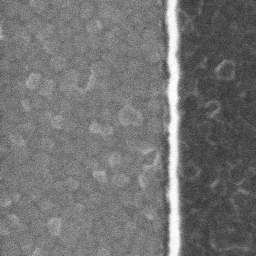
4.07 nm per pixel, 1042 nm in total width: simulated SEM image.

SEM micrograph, one or a few lines or trenches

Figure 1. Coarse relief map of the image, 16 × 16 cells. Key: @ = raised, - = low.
-----------@@@@@
-----------@@@@@
-----------@@@@@
-----------@@@@@
-----------@@@@@
-----------@@@@@
-----------@@@@@
-----------@@@@@
-----------@@@@@
-----------@@@@@
-----------@@@@@
-----------@@@@@
-----------@@@@@
-----------@@@@@
-----------@@@@@
-----------@@@@@